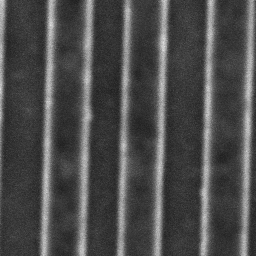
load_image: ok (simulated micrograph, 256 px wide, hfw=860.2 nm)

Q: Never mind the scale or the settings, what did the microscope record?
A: one or a few lines or trenches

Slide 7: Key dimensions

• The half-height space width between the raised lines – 148 nanometers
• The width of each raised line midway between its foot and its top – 132 nanometres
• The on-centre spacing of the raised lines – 270 nm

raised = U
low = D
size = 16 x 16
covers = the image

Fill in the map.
DDDUUUDDUUDDDUUU
DDDUUUDDUUDDDUUU
DDDUUUDDUUDDDUUU
DDDUUUDDUUDDDUUU
DDDUUDDDUUDDDUUU
DDDUUDDDUUDDDUUU
DDDUUDDDUUDDDUUU
DDDUUDDDUUDDDUUU
DDDUUDDDUUDDDUUD
DDDUUDDDUUDDDUUD
DDDUUDDDUUDDDUUD
DDDUUDDDUUDDDUUD
DDDUUDDDUUDDDUUD
DDDUUDDDUUDDDUUD
DDDUUDDDUUDDDUUD
DDDUUDDDUUDDDUUD